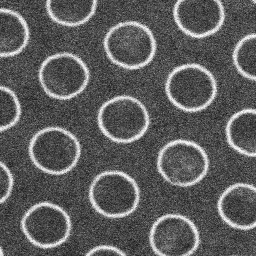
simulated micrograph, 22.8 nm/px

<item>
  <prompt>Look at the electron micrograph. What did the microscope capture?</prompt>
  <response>a regular array of raised bodies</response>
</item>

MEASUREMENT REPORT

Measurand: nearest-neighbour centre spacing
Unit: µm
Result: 1.68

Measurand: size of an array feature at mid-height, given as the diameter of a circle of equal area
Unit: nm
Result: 1040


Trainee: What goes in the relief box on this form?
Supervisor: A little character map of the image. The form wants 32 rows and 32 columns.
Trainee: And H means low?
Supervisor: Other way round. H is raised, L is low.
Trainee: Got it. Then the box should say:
LLLLLLHHHHHHLLLLLLLLLLHHHHHLLLLL
HLLLLLHHHHHHLLLLLLLLLLHHHHHHLLLL
HHHLLLLHHHHLLLLLLLLLLLHHHHHHLLLL
HHHLLLLLLLLLLLHHHHLLLLLHHHHLLLLL
HHHLLLLLLLLLLLHHHHHLLLLLLLLLLLLL
HHHLLLLLLLLLLHHHHHHLLLLLLLLLLLHH
HHLLLLLLLLLLLLHHHHHLLLLLLLLLLHHH
LLLLLLHHHHLLLLHHHHHLLLLLLLLLLHHH
LLLLLHHHHHHLLLLLLLLLLLLHHLLLLLHH
LLLLLHHHHHHLLLLLLLLLLHHHHHLLLLLH
LLLLLHHHHHHLLLLLLLLLLHHHHHHLLLLL
HLLLLLHHHHLLLLLLLLLLLHHHHHHLLLLL
HHLLLLLLLLLLLLHHHLLLLLHHHHLLLLLL
HHLLLLLLLLLLLHHHHHLLLLLHHLLLLLLL
HHLLLLLLLLLLHHHHHHLLLLLLLLLLLHHH
HLLLLLLLLLLLLHHHHHLLLLLLLLLLLHHH
LLLLLHHHLLLLLHHHHHLLLLLLLLLLLHHH
LLLLHHHHHLLLLLLHLLLLLLLLLLLLLHHH
LLLLHHHHHHLLLLLLLLLLLHHHHLLLLLHH
LLLLHHHHHHLLLLLLLLLLHHHHHHLLLLLL
LLLLLHHHHLLLLLLLLLLLHHHHHHLLLLLL
HLLLLLHHLLLLLLLLLLLLHHHHHHLLLLLL
HLLLLLLLLLLLHHHHLLLLLLHHHLLLLLLL
HLLLLLLLLLLHHHHHHLLLLLLLLLLLLHHH
HLLLLLLLLLLHHHHHHLLLLLLLLLLLHHHH
LLLLLLLLLLLLHHHHHLLLLLLLLLLHHHHH
LLLLHHHHLLLLLHHHLLLLLLLLLLLLHHHH
LLLHHHHHLLLLLLLLLLLLHHHLLLLLHHHH
LLLHHHHHHLLLLLLLLLLHHHHHLLLLLLLL
LLLLHHHHLLLLLLLLLLLHHHHHHLLLLLLL
LLLLLHHLLLLLLLLLLLLHHHHHHLLLLLLL
LLLLLLLLLLLHHHHLLLLLHHHHLLLLLLLL